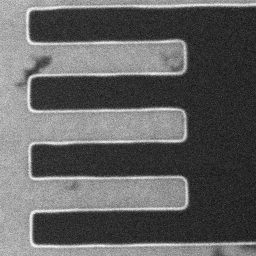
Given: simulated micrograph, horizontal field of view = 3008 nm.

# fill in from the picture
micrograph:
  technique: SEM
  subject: groups of lines, slits or small figures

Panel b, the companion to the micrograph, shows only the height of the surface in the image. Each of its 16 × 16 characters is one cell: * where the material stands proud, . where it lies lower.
...*************
..**************
..**************
............****
...........*****
..**************
..**************
............****
...........*****
..**************
..**************
............****
............****
..**************
..**************
................